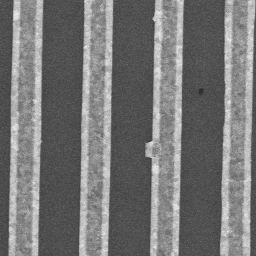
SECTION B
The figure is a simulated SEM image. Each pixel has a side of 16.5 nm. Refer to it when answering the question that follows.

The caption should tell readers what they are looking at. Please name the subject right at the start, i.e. one or a few lines or trenches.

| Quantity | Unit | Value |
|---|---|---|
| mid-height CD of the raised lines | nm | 357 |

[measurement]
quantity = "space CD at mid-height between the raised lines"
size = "0.811 µm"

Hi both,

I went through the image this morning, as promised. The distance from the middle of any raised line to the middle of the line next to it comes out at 1170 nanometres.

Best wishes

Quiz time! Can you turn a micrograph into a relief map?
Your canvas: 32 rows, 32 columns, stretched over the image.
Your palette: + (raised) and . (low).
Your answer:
..+++......+++......+++......++.
..+++......+++......++.......++.
..+++......+++......++.......++.
..+++......+++......++.......++.
..+++......+++......++.......++.
..+++......+++......++.......++.
..+++......+++......++.......++.
..+++......+++......++.......++.
..+++......+++......++.......++.
..+++......++.......++.......++.
..+++......++.......++.......++.
..+++......++.......++.......++.
..+++......++.......++.......++.
..+++......++.......++......+++.
..+++......++.......++......+++.
..+++......++.......++......+++.
..+++......++.......++......+++.
..+++......++......+++......+++.
..+++......++......+++......+++.
..+++......++......+++......+++.
..+++......++.......++......+++.
..+++......++......+++......+++.
..++.......++......+++......+++.
..++.......++......+++......+++.
..++......+++......+++......+++.
..++......+++......+++......+++.
..++......+++......+++......+++.
..++......+++......+++......+++.
..++......+++......+++......+++.
..++......+++......+++......+++.
..++......+++......+++......+++.
..++......+++......+++......+++.